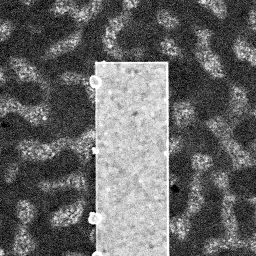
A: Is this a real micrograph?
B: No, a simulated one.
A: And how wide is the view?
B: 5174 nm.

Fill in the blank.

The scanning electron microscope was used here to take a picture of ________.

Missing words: one or a few lines or trenches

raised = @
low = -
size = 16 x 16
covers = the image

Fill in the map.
----------------
----------------
----------------
----------------
------@@@@------
------@@@@------
------@@@@------
------@@@@------
------@@@@------
------@@@@@-----
------@@@@------
------@@@@------
------@@@@------
------@@@@------
------@@@@------
------@@@@------